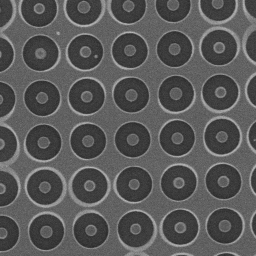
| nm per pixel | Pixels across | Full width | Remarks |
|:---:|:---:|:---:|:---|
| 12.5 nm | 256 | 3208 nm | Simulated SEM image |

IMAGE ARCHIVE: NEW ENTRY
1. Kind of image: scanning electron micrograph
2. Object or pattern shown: an array of small figures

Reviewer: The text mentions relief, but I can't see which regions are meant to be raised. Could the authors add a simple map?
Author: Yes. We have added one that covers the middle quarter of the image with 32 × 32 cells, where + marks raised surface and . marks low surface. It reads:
++......++++++.....+++++++...+++
++++..++++++++++++++++++++++++++
++++++++++++++++++++++++++++++++
+++++.+++++++++...++++++++....++
+++......++++.......+++++......+
++........+++........+++........
++........++.........+++...++...
+....++...++....++...+++...++...
+...+++...++....++...+++...++...
+.........+++........+++........
++........+++.......++++.......+
++.......+++++.....++++++.....++
++++...+++++++++++++++++++++++++
++++++++++++++++++++++++++++++++
++++++++++++++++..++++++++....++
+++.....++++++......+++++.......
++........+++........+++........
++........+++........+++...++...
+....++...+++...++....++...+++..
++...++....++...++....++...++...
++...++...+++........+++........
++........+++........++++.......
+++......++++++.....++++++.....+
++++....++++++++.+++++++++++++++
++++++++++++++++++++++++++++++++
+++++++++++++++++.+++++++++....+
++++.....++++++.....++++++......
+++.......++++.......++++.......
++.........++.........++........
++....+....++....++...++....++..
+....+++...++...+++...++....++..
++....+....++.........+++.......